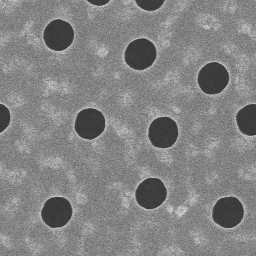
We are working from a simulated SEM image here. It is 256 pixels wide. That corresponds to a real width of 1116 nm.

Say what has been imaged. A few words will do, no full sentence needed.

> a regular array of holes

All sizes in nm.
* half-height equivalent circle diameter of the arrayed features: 135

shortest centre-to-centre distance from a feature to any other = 0.328 microns